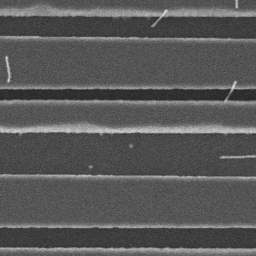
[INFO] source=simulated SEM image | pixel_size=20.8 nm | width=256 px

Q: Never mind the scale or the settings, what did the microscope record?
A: lines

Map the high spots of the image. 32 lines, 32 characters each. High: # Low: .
################################
################################
................................
................................
................................
################################
################################
################################
################################
################################
################################
................................
............................#...
################################
################################
################################
................................
................................
................................
................................
................................
................................
################################
################################
################################
################################
################################
################################
................................
................................
................................
################################